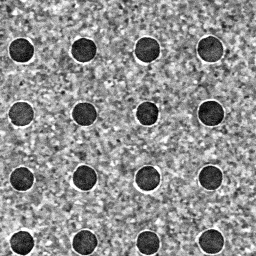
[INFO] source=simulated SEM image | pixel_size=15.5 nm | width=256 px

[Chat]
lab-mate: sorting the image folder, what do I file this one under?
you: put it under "a regular array of holes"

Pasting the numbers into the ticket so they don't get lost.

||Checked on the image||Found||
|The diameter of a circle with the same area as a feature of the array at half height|25.6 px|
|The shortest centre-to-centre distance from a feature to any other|0.979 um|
